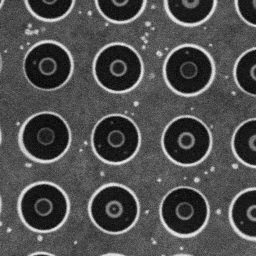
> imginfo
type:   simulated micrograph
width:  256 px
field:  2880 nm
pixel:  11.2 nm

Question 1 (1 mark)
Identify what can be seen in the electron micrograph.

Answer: an array of small figures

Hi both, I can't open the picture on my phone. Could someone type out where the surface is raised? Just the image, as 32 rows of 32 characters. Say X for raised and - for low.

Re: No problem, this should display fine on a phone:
XXX------XXX------XXX--X---XXX--
XXXX----XXXXX----XXXX-----XXXX--
XXXXXX-XXXXXXX--XXXXXX---XXXXXX-
XXXXXXXXXXXXXXXXXXXXXXXXXXXXXXXX
XXXXXXXXXXXXXXXXXXXXXXXXXXXXXXXX
XXXXX--XXXXXXXXXXXXXXXXXXXXXXXXX
XXXX----XXXXX----XXXXX----XXXXX-
XXX--X---XXX------XXX-----XXXX--
XXX--XX--XXX--XX--XXX--XX--XX---
XXX------XXX------XXX--X---XX---
XXXX----XXXXX----XXXX-----XXXX--
XXXXXXXXXXXXXXXXXXXXXX---XXXXXX-
XXXXXXXXXXXXXXXXXXXXXXXXXXXXXXXX
XXXXXXXXXXXXXXXXXXXXXXXXXXXXXXXX
XXXX---XXXXXXX-XXXXXXXXXXXXXXXXX
XXX-----XXXX-----XXXX----XXXXX--
XXX--XX--XXX--X--XXXX-----XXX---
XXX--XX--XXX--X--XXX--XX--XXX---
XXX-----XXXX-----XXX------XXX---
XXXX---XXXXX-----XXXX-----XXXX--
XXXXXXXXXXXXXXXXXXXXXXX-XXXXXXX-
XXXXXXXXXXXXXXXXXXXXXXXXXXXXXXXX
XXXXXXXXXXXXXXXXXXXXXXXXXXXXXXXX
XXXX---XXXXXX---XXXXXXXXXXXXXXXX
XXX-----XXXX-----XXXX----XXXXX--
XX---X--XXX---X--XXX------XXX---
XX---X--XXX---X--XXX--XX--XXX--X
XXX-----XXXX-----XXX------XXX---
XXXX---XXXXXX---XXXXX----XXXX---
XXXXXXXXXXXXXXXXXXXXXXXXXXXXXX--
XXXXXXXXXXXXXXXXXXXXXXXXXXXXXXXX
XXXXXXXXXXXXXXXXXXXXXXXXXXXXXXXX